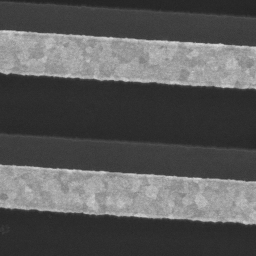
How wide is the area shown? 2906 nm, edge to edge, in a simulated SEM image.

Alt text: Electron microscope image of lines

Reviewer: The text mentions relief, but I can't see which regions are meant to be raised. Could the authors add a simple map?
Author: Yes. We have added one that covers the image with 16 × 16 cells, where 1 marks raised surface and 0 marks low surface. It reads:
1111110000000000
1111111111111111
1111111111111111
1111111111111111
1111111111111111
0000000000000001
0000000000000000
0000000000000000
1000000000000000
1111111111111111
1111111111111111
1111111111111111
1111111111111111
0000000111111111
0000000000000000
0000000000000000